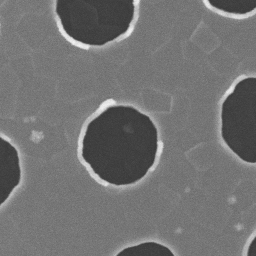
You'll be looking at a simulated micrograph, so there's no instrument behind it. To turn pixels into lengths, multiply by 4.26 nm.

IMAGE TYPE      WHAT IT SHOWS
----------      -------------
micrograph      holes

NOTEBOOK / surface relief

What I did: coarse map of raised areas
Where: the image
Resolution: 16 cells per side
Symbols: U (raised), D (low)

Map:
UUUUDDDDUUUUUUDD
UUUUDDDDUUUUUUUU
UUUUUDDUUUUUUUUU
UUUUUUUUUUUUUUUU
UUUUUUUUUUUUUUUU
UUUUUUUUUUUUUUUD
UUUUUUUUUUUUUUDD
UUUUUUDDDUUUUUDD
UUUUUDDDDDUUUUDD
DUUUUDDDDDUUUUUD
DUUUUUDDDUUUUUUU
DUUUUUUDUUUUUUUU
UUUUUUUUUUUUUUUU
UUUUUUUUUUUUUUUU
UUUUUUUUUUUUUUUU
UUUUUUUUDDUUUUUU